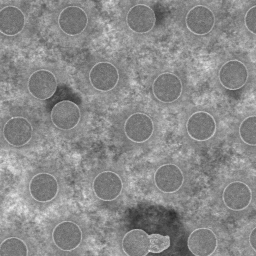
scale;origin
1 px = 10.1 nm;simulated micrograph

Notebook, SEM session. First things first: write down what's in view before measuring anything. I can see a regular array of raised bodies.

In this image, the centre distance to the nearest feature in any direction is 548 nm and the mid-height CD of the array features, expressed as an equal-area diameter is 29.1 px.